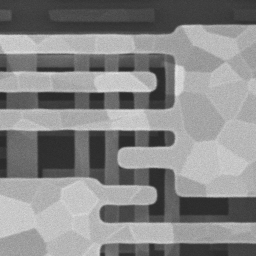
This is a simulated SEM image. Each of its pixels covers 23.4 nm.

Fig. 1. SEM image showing wiring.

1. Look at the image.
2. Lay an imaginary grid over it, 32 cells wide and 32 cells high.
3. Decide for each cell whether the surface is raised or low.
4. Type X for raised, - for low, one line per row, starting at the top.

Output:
--------------------------------
--------------------------------
--------------------------------
----------------------XXXXXXXXXX
XXXXXXXXXXXXXXXXXXXXXXXXXXXXXXXX
XXXXXXXXXXXXXXXXXXXXXXXXXXXXXXXX
XXXXXXXXXXXXXXXXXXXXXXXXXXXXXXXX
-XXX------X--XX--X---XXXXXXXXXXX
-XXX------X--XX--X---XXXXXXXXXXX
XXXXXXXXXXXXXXXXXXX--XXXXXXXXXXX
XXXXXXXXXXXXXXXXXXX--XXXXXXXXXXX
-XXXX----XXXXXX-XXX--XXXXXXXXXXX
-XXX------X--XX--X---XXXXXXXXXXX
-XXXX----XX--XX--XX--XXXXXXXXXXX
XXXXXXXXXXXXXXXXXXXXXXXXXXXXXXXX
XXXXXXXXXXXXXXXXXXXXXXXXXXXXXXXX
-XXXX----XX--XX--XX--XXXXXXXXXXX
-XXX------X--XX--X---XXXXXXXXXXX
-XXX------X--XXXXXXXXXXXXXXXXXXX
-XXX------X--XXXXXXXXXXXXXXXXXXX
-XXX------X--XXXXXXXXXXXXXXXXXXX
-XXX------X--XX--X---XXXXXXXXXXX
XXXXXXXXXXXX-XX--X----XXXXXXXXXX
XXXXXXXXXXXXXXXXXXX---XXXXXXXXXX
XXXXXXXXXXXXXXXXXXXX--XXXXXXXXXX
XXXXXXXXXXXXXXXXXXX----------XXX
XXXXXXXXXXXX-XX------X-------XXX
XXXXXXXXXXXXXXX--X---X-------XXX
XXXXXXXXXXXXXXXXXXXXXXXXXXXXXXXX
XXXXXXXXXXXXXXXXXXXXXXXXXXXXXXXX
XXXXXXXXXXXXXXX--XX-XX------XXXX
XXXXXXXXXXXX-XX--X---X-------XXX